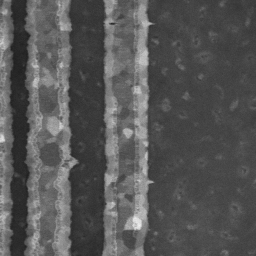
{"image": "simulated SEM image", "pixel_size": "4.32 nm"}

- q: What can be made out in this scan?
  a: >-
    one or a few lines or trenches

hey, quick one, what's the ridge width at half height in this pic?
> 146 nanometers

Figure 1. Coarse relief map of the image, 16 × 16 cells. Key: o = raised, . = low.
..oo...oo.......
..oo...oo.......
..oo...oo.......
..oo...oo.......
..oo...oo.......
..oo...oo.......
..oo...oo.......
..oo...oo.......
..oo...oo.......
..oo...oo.......
..oo...oo.......
..oo...oo.......
..oo...oo.......
..oo...oo.......
..oo...oo.......
..oo...oo.......